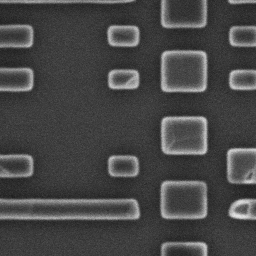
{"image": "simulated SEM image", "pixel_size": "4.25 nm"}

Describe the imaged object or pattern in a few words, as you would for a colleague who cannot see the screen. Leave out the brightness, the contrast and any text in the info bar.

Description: wiring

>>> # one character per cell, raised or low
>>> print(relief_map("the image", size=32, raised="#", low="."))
....................######......
....................######......
....................######......
####..........###............###
####..........###............###
####..........###............###
.....................####.......
....................######......
....................######......
####..........###...######...###
####..........###...######...###
................................
................................
................................
................................
....................######......
....................######......
....................######......
....................######......
###..........................###
####..........###............###
####..........###............###
.............................###
....................######......
....................######......
#################...######...###
#################...######...###
................................
................................
................................
.....................####.......
....................######......